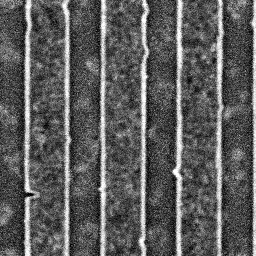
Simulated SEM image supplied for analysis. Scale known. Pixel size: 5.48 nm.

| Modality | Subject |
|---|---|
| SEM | one or a few lines or trenches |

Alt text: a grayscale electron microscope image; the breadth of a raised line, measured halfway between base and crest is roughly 224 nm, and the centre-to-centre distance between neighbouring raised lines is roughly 0.417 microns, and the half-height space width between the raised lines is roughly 191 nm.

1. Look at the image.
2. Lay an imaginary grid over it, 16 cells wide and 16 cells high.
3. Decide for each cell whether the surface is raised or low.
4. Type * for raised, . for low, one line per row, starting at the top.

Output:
..**..***..***..
..**..***..***..
..**..***..***..
..**..***..***..
..**..***..***..
..**..***..***..
..**..***..***..
..**..***..***..
..**..***..***..
..**..***..***..
..**..***..***..
..**..***..***..
..**..***..***..
..**..***..***..
..**..***..***..
..**..***..***..